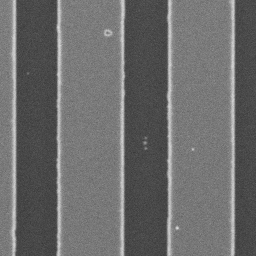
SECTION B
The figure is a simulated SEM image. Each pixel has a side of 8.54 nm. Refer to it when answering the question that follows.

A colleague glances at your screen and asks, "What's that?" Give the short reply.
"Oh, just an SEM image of lines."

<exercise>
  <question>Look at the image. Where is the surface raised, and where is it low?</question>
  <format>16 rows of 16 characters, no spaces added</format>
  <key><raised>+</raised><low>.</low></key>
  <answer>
+...++++...++++.
+...++++..+++++.
+...++++...++++.
+...++++...++++.
+...++++...++++.
+...++++..+++++.
+...++++..+++++.
+...++++..+++++.
+...++++...++++.
+...++++...++++.
+...++++..+++++.
+...++++...++++.
+...++++...++++.
+...++++..+++++.
+...++++..+++++.
+...++++..+++++.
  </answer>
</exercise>